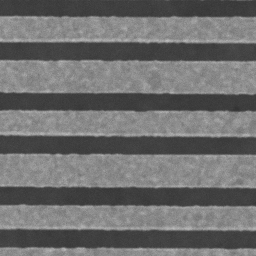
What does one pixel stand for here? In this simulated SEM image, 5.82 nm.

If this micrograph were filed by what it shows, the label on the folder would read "lines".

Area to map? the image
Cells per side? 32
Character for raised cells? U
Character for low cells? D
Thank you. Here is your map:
DDDDDDDDDDDDDDDDDDDDDDDDDDDDDDDD
DDDDDDDDDDDDDDDDDDDDDDDDDDDDDDDD
UUUUUUUUUUUUUUUUUUUUUUUUUUUUUUUU
UUUUUUUUUUUUUUUUUUUUUUUUUUUUUUUU
UUUUUUUUUUUUUUUUUUUUUUUUUUUUUUUU
DDDDDDDDDDDDDDDDDDDDDDDDDDDDDDDD
DDDDDDDDDDDDDDDDDDDDDDDDDDDDDDDD
DDDDDDDDDDDDDDDDDDDDDDDDDDDDDDDD
UUUUUUUUUUUUUUUUUUUUUUUUUUUUUUUU
UUUUUUUUUUUUUUUUUUUUUUUUUUUUUUUU
UUUUUUUUUUUUUUUUUUUUUUUUUUUUUUUU
UUUUUUUUUUUUUUUUUUUUUUUUUUUUUUUU
DDDDDDDDDDDDDDDDDDDDDDDDDDDDDDDD
DDDDDDDDDDDDDDDDDDDDDDDDDDDDDDDD
UUUUUUUUUUUUUUUUUUUUUUUUUUUUUUUU
UUUUUUUUUUUUUUUUUUUUUUUUUUUUUUUU
UUUUUUUUUUUUUUUUUUUUUUUUUUUUUUUU
DDDDDDDDDDDDDDDDDDDDDDDDDDDDDDDD
DDDDDDDDDDDDDDDDDDDDDDDDDDDDDDDD
UUUUUUUUUUUUUUUUUUUUUUUUUUUUUUUU
UUUUUUUUUUUUUUUUUUUUUUUUUUUUUUUU
UUUUUUUUUUUUUUUUUUUUUUUUUUUUUUUU
UUUUUUUUUUUUUUUUUUUUUUUUUUUUUUUU
DDDDDDDDDDDDDDDDDDDDDDDDDDDDDDDD
DDDDDDDDDDDDDDDDDDDDDDDDDDDDDDDD
DDDDDDDDDDDDDDDDDDDDDDDDDDDDDDDD
UUUUUUUUUUUUUUUUUUUUUUUUUUUUUUUU
UUUUUUUUUUUUUUUUUUUUUUUUUUUUUUUU
UUUUUUUUUUUUUUUUUUUUUUUUUUUUUUUU
DDDDDDDDDDDDDDDDDDDDDDDDDDDDDDDD
DDDDDDDDDDDDDDDDDDDDDDDDDDDDDDDD
UUUUUUUUUUUUUUUUUUUUUUUUUUUUUUUU